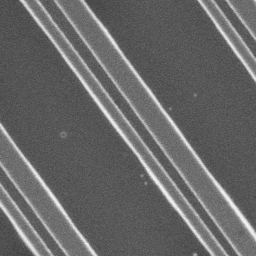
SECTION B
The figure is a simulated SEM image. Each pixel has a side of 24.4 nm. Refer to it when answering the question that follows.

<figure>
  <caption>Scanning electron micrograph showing lines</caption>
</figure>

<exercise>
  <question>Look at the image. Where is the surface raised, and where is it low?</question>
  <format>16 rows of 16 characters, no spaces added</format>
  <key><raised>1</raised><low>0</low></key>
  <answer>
0011110000000111
0001110000000011
0001111000000011
0000111100000001
0000011100000000
0000001110000000
0000001111000000
0000000111100000
0000000011100000
1000000011110000
1100000001111000
1110000000111100
1110000000011100
0111000000011110
0111100000001111
0011110000000111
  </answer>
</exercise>